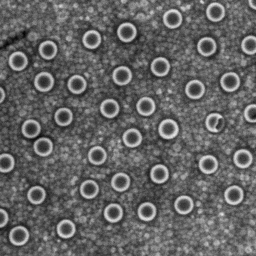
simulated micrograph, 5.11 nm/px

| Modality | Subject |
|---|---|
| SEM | a regular array of raised bodies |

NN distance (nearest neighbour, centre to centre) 178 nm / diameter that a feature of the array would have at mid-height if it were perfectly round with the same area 17.4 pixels